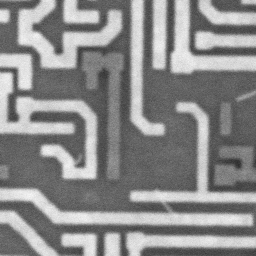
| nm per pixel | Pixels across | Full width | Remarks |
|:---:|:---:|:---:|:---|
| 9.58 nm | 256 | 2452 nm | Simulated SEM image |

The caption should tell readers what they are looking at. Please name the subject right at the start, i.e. wiring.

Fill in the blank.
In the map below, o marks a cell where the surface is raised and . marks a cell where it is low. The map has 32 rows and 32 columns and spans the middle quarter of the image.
ooo..oooooooooo..oo...ooo..ooooo
.....oooo..ooo...oo........ooooo
......oo...ooo...oo.............
......oo...ooo...oo.............
......oo...ooo...oo.............
......oo...ooo...oo.............
...........ooo...oo.............
...........ooo...oo.............
...........ooo...oo.............
oooo.......ooo...oo.............
oooooo.....ooo...oo.........oooo
ooooooo....ooo...oo.........oooo
....ooo....ooo...oo.............
.....ooo...ooo...ooo............
......oo...ooo...oooo...........
oo....oo...ooo....ooooooo.......
oo....oo...ooo.....oooooo.......
......oo...ooo..................
......oo...ooo..................
......oo...ooo..................
......oo...ooo..................
......oo...ooo..................
o.....oo...ooo..................
oo....oo...ooo..................
oo....oo...ooo..................
oo....oo...ooo..................
oooooooo...ooo..................
oooooooo...ooo..................
...........oo...................
................................
................................
................................